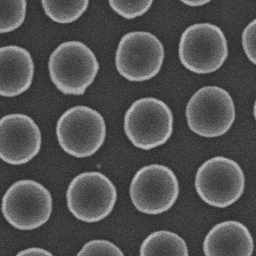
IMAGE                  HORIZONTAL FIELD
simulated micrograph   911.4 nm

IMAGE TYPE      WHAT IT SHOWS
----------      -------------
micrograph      a regular array of raised bodies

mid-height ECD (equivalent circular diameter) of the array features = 173 nm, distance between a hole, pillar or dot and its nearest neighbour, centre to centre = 228 nm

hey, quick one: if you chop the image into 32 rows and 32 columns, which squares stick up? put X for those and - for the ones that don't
XXX--XXXXXX---XXXXX----XX-------
XXX---XXXX-----XXX--------------
XXX----XX-----------------------
XX----------------------XXX----X
----------------XXX----XXXXX--XX
--------XX-----XXXXX---XXXXX--XX
XXX----XXXX----XXXXX--XXXXXX---X
XXXX--XXXXXX--XXXXXX---XXXXX---X
XXXX--XXXXXX---XXXXX---XXXX-----
XXXX--XXXXXX----XXX-------------
XXXX---XXXX---------------------
XXX-----XX---------------XXX----
------------------XX----XXXXX---
---------XX-----XXXXX--XXXXXX---
-XX-----XXXX----XXXXX--XXXXXX---
XXXX---XXXXXX---XXXXX---XXXXX---
XXXXX--XXXXXX---XXXXX----XXX----
XXXXX--XXXXXX---XXXXX-----------
XXXXX---XXXX------X-------------
XXXX-----X----------------------
--------------------------XXX---
-----------------XXXX----XXXXX--
---------XXXXX---XXXXX---XXXXX--
-XXXX----XXXXX--XXXXXX---XXXXX--
-XXXXX--XXXXXX--XXXXXX---XXXXX--
XXXXXX---XXXXX---XXXXX----XXX---
XXXXXX---XXXXX----XX------------
-XXXXX-----X--------------------
--XX-----------------------XXXX-
-------------------XXX----XXXXX-
-----------XXX----XXXXX---XXXXX-
---XXX----XXXXX---XXXXX---XXXXX-